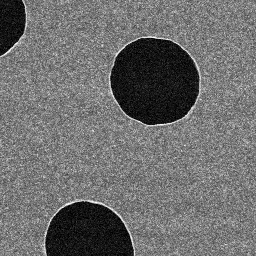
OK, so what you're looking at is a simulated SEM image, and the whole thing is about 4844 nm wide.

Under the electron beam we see holes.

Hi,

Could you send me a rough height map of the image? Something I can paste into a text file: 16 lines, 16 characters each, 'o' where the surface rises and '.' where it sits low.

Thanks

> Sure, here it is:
..oooooooooooooo
..oooooooooooooo
.oooooooo.oooooo
ooooooo.....oooo
ooooooo.....oooo
ooooooo.....oooo
ooooooo.....oooo
ooooooooo..ooooo
oooooooooooooooo
oooooooooooooooo
oooooooooooooooo
oooooooooooooooo
oooooooooooooooo
ooo....ooooooooo
ooo.....oooooooo
ooo.....oooooooo